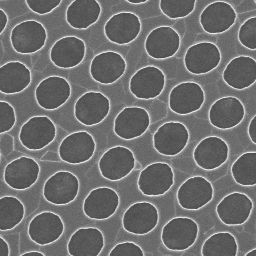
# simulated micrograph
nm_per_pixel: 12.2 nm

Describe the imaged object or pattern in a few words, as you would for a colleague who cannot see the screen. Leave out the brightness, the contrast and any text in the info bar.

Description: a regular array of holes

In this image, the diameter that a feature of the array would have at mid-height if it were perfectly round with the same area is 407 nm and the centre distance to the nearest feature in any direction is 0.513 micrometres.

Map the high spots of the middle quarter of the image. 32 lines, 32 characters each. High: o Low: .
...oooo........ooooooooooooooo..
ooooooo........oooo.....ooooooo.
ooooooo........ooo.......ooooooo
ooooooo.......ooo........ooooooo
.oooooooo...ooooo........ooooooo
.ooooooooooooooo.........ooo....
..ooooooooooooooo........oo.....
..ooo....oooooooo.......ooo.....
.ooo.......oooooooo...oooo......
ooo........ooooooooooooooo......
ooo........ooooooooooooooo......
ooo........oooo.....ooooooo.....
ooo........ooo.......oooooooo..o
ooo.......ooo........ooooooooooo
oooo.....oooo........oooooo.oooo
ooooooooooooo........ooo......oo
ooooooooooooo........oo........o
oo....ooooooo.......ooo........o
.......ooooooo...ooooo.........o
........oooooooooooooo.........o
........oooooooooooooo........oo
........ooo.....ooooooo......ooo
.......ooo.......ooooooo....oooo
.......oo.........oooooooooooooo
o....oooo.........oooooooooooooo
ooooooooo.........ooo.....oooooo
ooooooooo........ooo.......ooooo
..ooooooo.......ooo........ooooo
o..oooooooo...ooooo........ooooo
oo..oooooooooooooo.........ooo..
o...ooooooooooooooo........oo...
....ooo.....ooooooo.......ooo...